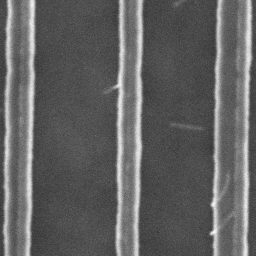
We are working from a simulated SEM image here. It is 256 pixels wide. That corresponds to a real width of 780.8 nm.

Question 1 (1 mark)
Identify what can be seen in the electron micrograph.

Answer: lines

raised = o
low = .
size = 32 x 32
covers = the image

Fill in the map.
.ooo...........oo..........oooo.
.ooo...........oo..........oooo.
.ooo...........oo..........oooo.
.ooo...........oo..........oooo.
.ooo...........oo..........oooo.
.ooo...........oo..........oooo.
.ooo...........oo..........oooo.
.ooo...........oo..........oooo.
.ooo...........oo..........oooo.
.ooo...........oo..........oooo.
.ooo...........oo..........oooo.
.ooo...........oo..........oooo.
.ooo...........oo..........oooo.
.ooo...........oo..........oooo.
.ooo...........oo..........oooo.
.ooo...........oo..........oooo.
.ooo...........oo..........oooo.
.ooo...........oo..........oooo.
.ooo...........oo..........oooo.
.ooo...........oo..........oooo.
.ooo...........oo..........oooo.
.ooo...........oo..........oooo.
.ooo...........oo..........oooo.
.ooo...........oo..........oooo.
.ooo...........oo..........oooo.
.ooo...........oo..........oooo.
.ooo...........oo..........oooo.
.ooo...........oo..........oooo.
.ooo...........oo..........oooo.
.ooo...........oo..........oooo.
.ooo...........oo..........oooo.
.ooo...........oo..........oooo.